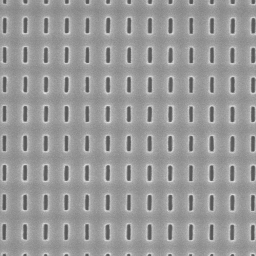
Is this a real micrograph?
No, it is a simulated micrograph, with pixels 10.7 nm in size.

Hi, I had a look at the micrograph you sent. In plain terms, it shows a regular array of holes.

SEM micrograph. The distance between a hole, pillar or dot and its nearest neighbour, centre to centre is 0.22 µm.